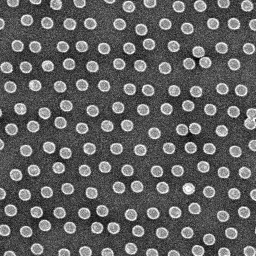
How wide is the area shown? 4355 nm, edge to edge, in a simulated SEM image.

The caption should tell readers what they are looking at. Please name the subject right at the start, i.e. a regular array of raised bodies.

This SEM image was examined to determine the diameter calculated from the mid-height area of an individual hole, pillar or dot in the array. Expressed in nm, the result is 188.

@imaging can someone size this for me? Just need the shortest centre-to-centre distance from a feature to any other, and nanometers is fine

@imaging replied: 339